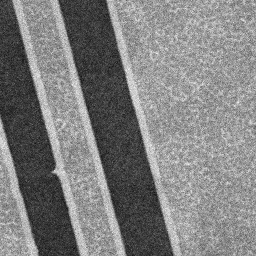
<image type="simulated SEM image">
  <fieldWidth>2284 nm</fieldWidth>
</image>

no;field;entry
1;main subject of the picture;one or a few lines or trenches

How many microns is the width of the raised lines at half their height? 0.329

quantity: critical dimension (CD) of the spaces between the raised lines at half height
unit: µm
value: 0.473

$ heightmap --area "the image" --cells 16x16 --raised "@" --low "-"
-@@@---@@@@@@@@@
-@@@---@@@@@@@@@
--@@---@@@@@@@@@
--@@----@@@@@@@@
--@@@---@@@@@@@@
--@@@---@@@@@@@@
---@@----@@@@@@@
---@@----@@@@@@@
---@@@---@@@@@@@
----@@---@@@@@@@
@---@@----@@@@@@
@---@@----@@@@@@
@---@@@---@@@@@@
@----@@---@@@@@@
@@---@@----@@@@@
@@---@@@---@@@@@